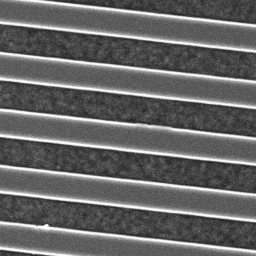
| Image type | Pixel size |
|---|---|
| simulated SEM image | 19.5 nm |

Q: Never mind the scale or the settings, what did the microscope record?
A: parallel lines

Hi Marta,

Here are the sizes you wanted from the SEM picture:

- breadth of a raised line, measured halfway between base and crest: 518 nanometers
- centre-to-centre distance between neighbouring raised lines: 1090 nm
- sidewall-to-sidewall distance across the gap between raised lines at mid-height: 0.583 µm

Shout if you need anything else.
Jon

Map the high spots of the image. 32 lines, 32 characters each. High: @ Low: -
@@@@@@@@------------------------
@@@@@@@@@@@@@@@@@---------------
@@@@@@@@@@@@@@@@@@@@@@@@@@------
------@@@@@@@@@@@@@@@@@@@@@@@@@@
--------------@@@@@@@@@@@@@@@@@@
-----------------------@@@@@@@@@
--------------------------------
@@@@@@@@------------------------
@@@@@@@@@@@@@@@@----------------
@@@@@@@@@@@@@@@@@@@@@@@@@-------
------@@@@@@@@@@@@@@@@@@@@@@@@@@
--------------@@@@@@@@@@@@@@@@@@
-----------------------@@@@@@@@@
--------------------------------
@@@@@@@-------------------------
@@@@@@@@@@@@@@@@----------------
@@@@@@@@@@@@@@@@@@@@@@@@@-------
-----@@@@@@@@@@@@@@@@@@@@@@@@@@@
-------------@@@@@@@@@@@@@@@@@@@
----------------------@@@@@@@@@@
-------------------------------@
@@@@@@--------------------------
@@@@@@@@@@@@@@@-----------------
@@@@@@@@@@@@@@@@@@@@@@@@--------
----@@@@@@@@@@@@@@@@@@@@@@@@@@@@
------------@@@@@@@@@@@@@@@@@@@@
----------------------@@@@@@@@@@
------------------------------@@
@@@@@@--------------------------
@@@@@@@@@@@@@@@-----------------
@@@@@@@@@@@@@@@@@@@@@@@@--------
----@@@@@@@@@@@@@@@@@@@@@@@@@@@@